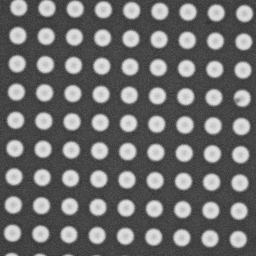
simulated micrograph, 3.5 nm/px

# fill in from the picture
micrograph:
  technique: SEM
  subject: an array of small figures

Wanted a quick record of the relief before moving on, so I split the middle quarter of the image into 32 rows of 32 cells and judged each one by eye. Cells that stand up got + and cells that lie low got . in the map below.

++++...++++....+++....++++...+++
.+++....+++....+++....++++...+++
.........+......++....+++....+++
................................
................................
..+.............................
++++....+++....+++....+++....+++
++++...++++...++++...++++....+++
.+++...++++...++++...++++...++++
.........+.....+++....+++....+++
................................
................................
................................
++++...++++....+++....+++....++.
++++...++++...++++...++++...++++
++++...++++...++++...++++...++++
........++.....++.....+++....+++
................................
................................
................................
++++...+++....+++.....++.....++.
++++...++++...++++...++++...++++
++++...++++...++++...++++...++++
........++.....++.....++....++++
................................
................................
................................
+++....+++....+++.....++.....++.
++++...++++...++++...++++...++++
+++....++++...++++...++++...++++
.+......++....+++....+++....++++
................................